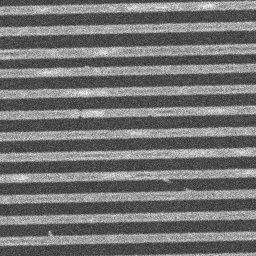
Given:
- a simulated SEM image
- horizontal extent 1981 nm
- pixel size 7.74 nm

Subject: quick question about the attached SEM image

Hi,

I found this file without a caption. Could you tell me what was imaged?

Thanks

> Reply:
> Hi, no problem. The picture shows parallel lines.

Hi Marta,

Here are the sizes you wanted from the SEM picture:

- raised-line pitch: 162 nm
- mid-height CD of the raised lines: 60.9 nm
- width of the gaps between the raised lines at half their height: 98.6 nm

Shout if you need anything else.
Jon